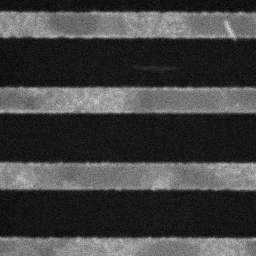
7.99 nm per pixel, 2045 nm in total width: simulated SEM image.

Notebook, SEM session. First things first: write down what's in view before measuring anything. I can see lines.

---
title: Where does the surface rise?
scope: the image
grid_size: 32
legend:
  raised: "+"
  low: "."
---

................................
................................
++++++++++++++++++++++++++++++++
++++++++++++++++++++++++++++++++
++++++++++++++++++++++++++++++++
................................
................................
................................
................................
................................
................................
++++++++++++++++++++++++++++++++
++++++++++++++++++++++++++++++++
++++++++++++++++++++++++++++++++
................................
................................
................................
................................
................................
................................
++++...+....++...+..............
++++++++++++++++++++++++++++++++
++++++++++++++++++++++++++++++++
++++++++++++++++++++++++++++++++
................................
................................
................................
................................
................................
................................
++++++++++++++++++++++++++++++++
++++++++++++++++++++++++++++++++